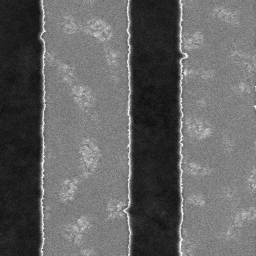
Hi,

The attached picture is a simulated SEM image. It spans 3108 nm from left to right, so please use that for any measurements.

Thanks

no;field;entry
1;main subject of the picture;one or a few lines or trenches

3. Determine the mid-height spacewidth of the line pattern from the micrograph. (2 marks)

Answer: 1030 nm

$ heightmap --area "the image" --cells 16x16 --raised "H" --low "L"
HHHLLLLLHHHLLLLL
HHHLLLLLHHHLLLLL
HHHLLLLLHHHLLLLL
HHHLLLLLHHHLLLLL
HHHLLLLLHHHLLLLL
HHHLLLLLHHHLLLLL
HHHLLLLLHHHLLLLL
HHHLLLLLHHHLLLLL
HHHLLLLLHHHLLLLL
HHHLLLLLHHHLLLLL
HHHLLLLLHHHLLLLL
HHHLLLLLHHHLLLLL
HHHLLLLLHHHLLLLL
HHHLLLLLHHHLLLLL
HHHLLLLLHHHLLLLL
HHHLLLLLHHHLLLLL